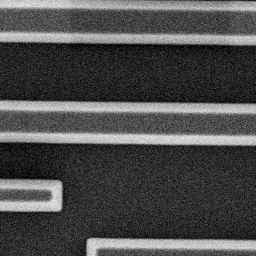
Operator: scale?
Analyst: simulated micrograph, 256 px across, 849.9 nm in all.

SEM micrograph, groups of lines, slits or small figures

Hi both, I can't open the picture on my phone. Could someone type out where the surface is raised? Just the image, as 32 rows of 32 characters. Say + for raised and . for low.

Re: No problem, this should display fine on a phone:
+++++++++++.....................
++++++++++++++++++++++++++++++++
++++++++++++++++++++++++++++++++
++++++++++++++++++++++++++++++++
++++++++++++++++++++++++++++++++
................................
................................
................................
................................
................................
................................
................................
................................
++++++++++++++++++++++++++++....
++++++++++++++++++++++++++++++++
++++++++++++++++++++++++++++++++
++++++++++++++++++++++++++++++++
....................++++++++++++
................................
................................
................................
................................
................................
+++++++.........................
+++++++.........................
+++++++.........................
................................
................................
................................
................................
............+++++++.............
...........+++++++++++++++++++++